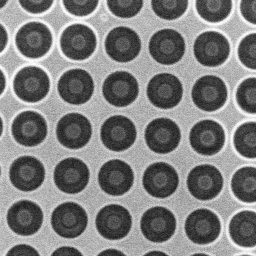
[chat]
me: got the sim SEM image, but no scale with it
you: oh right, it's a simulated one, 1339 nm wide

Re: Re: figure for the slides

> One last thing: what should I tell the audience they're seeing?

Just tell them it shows an array of small figures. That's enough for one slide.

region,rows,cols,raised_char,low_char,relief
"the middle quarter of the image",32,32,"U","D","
UUUUUUUUUUUUUUUUUUUUUUUUUUUUUUUU
UDDDDUUUUUUUUUDUUUUUUUUUUUUUUUUU
DDDDDDUUUUUDDDDDDUUUUUUDDDDUUUUU
DDDDDDDUUUDDDDDDDDUUUUDDDDDDUUUU
DDDDDDDDUUDDDDDDDDUUUDDDDDDDDUUU
DDDDDDDDUDDDDDDDDDDUUDDDUUDDDDUU
DDDDDDDDUDDDDDDDDDDUDDDDUUUDDDUU
DDDDDDDUUUDDDDDDDDDUDDDDUUUDDDUU
DDDDDDDUUUDDDDDDDDUUUDDDDDDDDDUU
DDDDDDUUUUUDDDDDDUUUUDDDDDDDDUUU
UUUUUUUUUUUUDDDDUUUUUUDDDDDDUUUU
UUUUUUUUUUUUUUUUUUUUUUUUUDUUUUUU
UDDDUUUUUUUUUUUUUUUUUUUUUUUUUUUU
DDDDDDUUUUUDDDDDUUUUUUUDDDUUUUUU
DDDDDDDUUUDDDDDDDUUUUDDDDDDDUUUU
DDDDDDDUUDDDDDDDDDUUUDDDDDDDDUUU
DDDDDDDUUDDDDDDDDDUUDDDDDDDDDUUU
DDDDDDDUUDDDDDDDDDUUDDDDDDDDDUUD
DDDDDDDUUDDDDDDDDDUUDDDDDDDDDUUD
DDDDDDUUUDDDDDDDDDUUDDDDDDDDDUUD
DDDDDUUUUUDDDDDDDUUUUDDDDDDDDUUU
UUDUUUUUUUUDDDDDUUUUUUDDDDDDUUUU
UUUUUUUUUUUUUUUUUUUUUUUDDDUUUUUU
UDDDUUUUUUUUUUUUUUUUUUUUUUUUUUUU
DDDDDUUUUUDDDDDUUUUUUUUDDUUUUUUU
DDDDDDUUUDDDDDDDDUUUUDDDDDDUUUUU
DDDDDDUUUDDDDDDDDUUUDDDDDDDDUUUU
DDDDDDDUDDDDDDDDDDUUDDDDDDDDUUUD
DDDDDDDUDDDDDDDDDDUDDDDDDDDDDUUD
DDDDDDUUDDDDDDDDDDUDDDDDDDDDDUDD
DDDDDDUUUDDDDDDDDUUUDDDDDDDDDUUD
DDDDDUUUUDDDDDDDUUUUDDDDDDDDUUUD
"